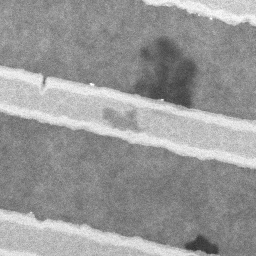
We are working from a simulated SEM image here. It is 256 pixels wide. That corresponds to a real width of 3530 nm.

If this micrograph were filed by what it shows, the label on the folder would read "one or a few lines or trenches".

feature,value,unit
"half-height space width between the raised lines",1450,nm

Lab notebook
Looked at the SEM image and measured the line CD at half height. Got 470 nm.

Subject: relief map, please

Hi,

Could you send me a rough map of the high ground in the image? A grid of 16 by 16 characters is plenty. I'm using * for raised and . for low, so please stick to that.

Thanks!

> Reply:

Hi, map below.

.............***
................
................
................
................
****............
*********.......
....*********...
........********
............****
................
................
................
................
*****...........
*********.......